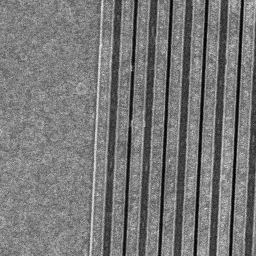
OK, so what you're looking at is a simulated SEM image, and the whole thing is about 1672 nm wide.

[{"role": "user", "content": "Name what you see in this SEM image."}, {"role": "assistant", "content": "parallel lines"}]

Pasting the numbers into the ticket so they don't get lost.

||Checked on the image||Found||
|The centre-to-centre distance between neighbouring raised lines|116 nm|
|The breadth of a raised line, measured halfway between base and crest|0.0807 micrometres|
